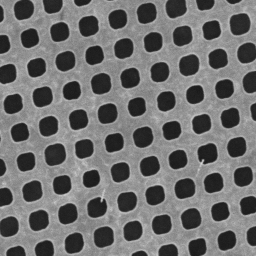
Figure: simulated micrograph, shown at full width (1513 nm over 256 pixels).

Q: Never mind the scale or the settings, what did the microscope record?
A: a regular array of holes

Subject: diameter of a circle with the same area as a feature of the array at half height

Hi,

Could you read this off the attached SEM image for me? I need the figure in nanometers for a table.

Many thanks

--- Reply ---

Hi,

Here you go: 119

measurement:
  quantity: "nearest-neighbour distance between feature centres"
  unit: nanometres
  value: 175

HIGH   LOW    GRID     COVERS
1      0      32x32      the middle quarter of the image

00011111111111111111110000111000
01111111111111100011110000111000
11111111100111000001110000111000
11111110000011000001110000111111
10011110000011000001111011111111
00001110000011100011111111111111
00001110000011111111111111111110
00001111001111111111111100001110
00011111111111111100111000001110
11111111111111110000111000001110
11111111100001110000111000001111
11100111000001110000011100111111
10000011000001111000111111111111
10000011000001111111111111111111
10000011100011111111111111000111
11000011111111111111111110000111
11011111111111111100001110000111
11111111111100111000001110000111
11111111110000011000001110001111
11100001110000011000001111111111
11100001110000011100011111111111
11100001111000111111111111110011
01100001111111111111111111100001
11110111111111111111000111000001
11111111111111111110000011000001
11111111111100001110000011100011
11111110111100001110000011111111
11111000011100001111000111111111
01111000011100001111111111111111
00111000011110111111111111110000
00111000111111111111110011110000
00111111111111111111100001110000